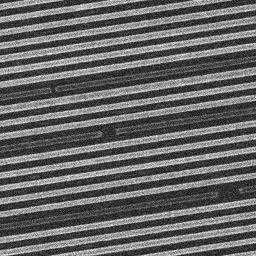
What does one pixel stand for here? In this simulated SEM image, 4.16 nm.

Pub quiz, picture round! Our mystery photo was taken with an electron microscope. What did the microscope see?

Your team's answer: parallel lines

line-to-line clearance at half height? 7.28 px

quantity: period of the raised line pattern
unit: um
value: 0.0534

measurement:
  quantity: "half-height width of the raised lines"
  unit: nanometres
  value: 22.6